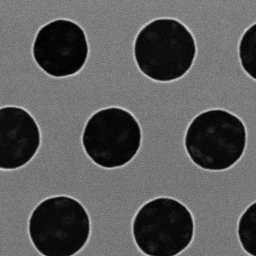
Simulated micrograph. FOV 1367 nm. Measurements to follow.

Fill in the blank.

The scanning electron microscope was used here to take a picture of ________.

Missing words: holes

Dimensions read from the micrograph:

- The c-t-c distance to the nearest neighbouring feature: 548 nm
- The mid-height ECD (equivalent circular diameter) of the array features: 0.317 um